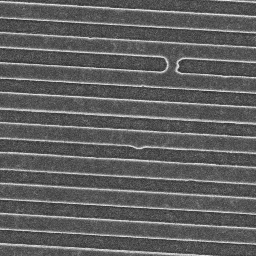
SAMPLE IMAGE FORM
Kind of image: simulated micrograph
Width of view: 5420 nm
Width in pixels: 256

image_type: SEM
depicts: parallel lines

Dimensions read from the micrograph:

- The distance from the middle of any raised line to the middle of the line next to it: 639 nm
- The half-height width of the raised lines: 349 nm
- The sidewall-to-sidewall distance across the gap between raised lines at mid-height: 285 nanometres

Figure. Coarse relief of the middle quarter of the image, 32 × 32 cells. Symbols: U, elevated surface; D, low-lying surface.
DDDDDDDDDDDDDDDDDDDDDDDDDDUUUDDD
UUUUUUUUUUUUUUUUDDDDDDDDDUUUDDDD
UUUUUUUUUUUUUUUUUUUUUUUUUUUUUUUU
UUUUUUUUUUUUUUUUUUUUUUUUUUUUUUUU
UUUUUUUUUUUUUUUUUUUUUUUUUUUUUUUU
DDDDDDDDDDDDDDDDDUUUUUUUUUUUUUUU
DDDDDDDDDDDDDDDDDDDDDDDDDDDDDDDD
DDDDDDDDDDDDDDDDDDDDDDDDDDDDDDDD
UUUUUUUDDDDDDDDDDDDDDDDDDDDDDDDD
UUUUUUUUUUUUUUUUUUUUUUUUDDDDDDDD
UUUUUUUUUUUUUUUUUUUUUUUUUUUUUUUU
UUUUUUUUUUUUUUUUUUUUUUUUUUUUUUUU
DDDDDUUUUUUUUUUUUUUUUUUUUUUUUUUU
DDDDDDDDDDDDDDDDDDDDDDUUUUUUUUUU
DDDDDDDDDDDDDDDDDDDDDDDDDDDDDDDD
DDDDDDDDDDDDDDDDDDDDDDDDDDDDDDDD
UUUUUUUUUUUUUUUUDDDDDDDDDDDDDDDD
UUUUUUUUUUUUUUUUUUUUUUUUUUUUUUUU
UUUUUUUUUUUUUUUUUUUUUUUUUUUUUUUU
UUUUUUUUUUUUUUUUUUUUUUUUUUUUUUUU
DDDDDDDDDDDDDDDDDUUUUUUUUUUUUUUU
DDDDDDDDDDDDDDDDDDDDDDDDDDDDDDUD
DDDDDDDDDDDDDDDDDDDDDDDDDDDDDDDD
UUUUUUUDDDDDDDDDDDDDDDDDDDDDDDDD
UUUUUUUUUUUUUUUUUUUUUUUUDDDDDDDD
UUUUUUUUUUUUUUUUUUUUUUUUUUUUUUUU
UUUUUUUUUUUUUUUUUUUUUUUUUUUUUUUU
DDDDDUUUUUUUUUUUUUUUUUUUUUUUUUUU
DDDDDDDDDDDDDDDDDDDDDDUUUUUUUUUU
DDDDDDDDDDDDDDDDDDDDDDDDDDDDDDDD
DDDDDDDDDDDDDDDDDDDDDDDDDDDDDDDD
UUUUUUUUUUUUDDDDDDDDDDDDDDDDDDDD